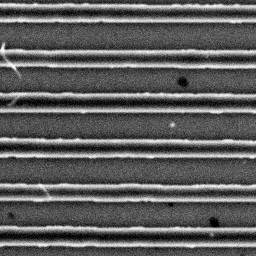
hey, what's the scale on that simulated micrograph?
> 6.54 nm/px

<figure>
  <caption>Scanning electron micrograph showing lines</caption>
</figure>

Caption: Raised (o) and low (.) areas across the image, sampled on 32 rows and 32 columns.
................................
oooooooooooooooooooooooooooooooo
oooooooooooooooooooooooooooooooo
................................
................................
................................
oooooooooooooooooooooooooooooooo
oooooooooooooooooooooooooooooooo
................................
................................
................................
................................
oooooooooooooooooooooooooooooooo
oooooooooooooooooooooooooooooooo
................................
................................
................................
oooooo.o.o......................
oooooooooooooooooooooooooooooooo
o.oooooooooooooooooooooooooooooo
................................
................................
................................
oooooooooooooooooooooooooooooooo
oooooooooooooooooooooooooooooooo
................................
................................
................................
oooooooooooo....oo...ooo........
oooooooooooooooooooooooooooooooo
oooooooooooooooooooooooooooooooo
................................